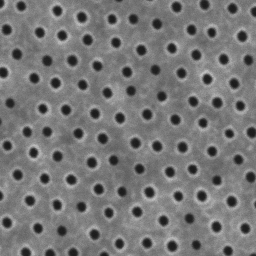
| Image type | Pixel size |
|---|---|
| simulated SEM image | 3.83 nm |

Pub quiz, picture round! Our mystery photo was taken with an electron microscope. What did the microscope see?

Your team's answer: a regular array of holes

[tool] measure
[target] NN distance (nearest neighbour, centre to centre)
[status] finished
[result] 92 nanometres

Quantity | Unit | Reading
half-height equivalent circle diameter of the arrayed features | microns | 0.0389